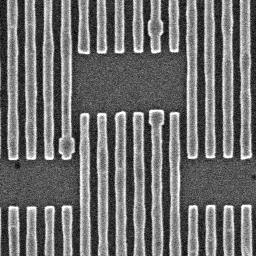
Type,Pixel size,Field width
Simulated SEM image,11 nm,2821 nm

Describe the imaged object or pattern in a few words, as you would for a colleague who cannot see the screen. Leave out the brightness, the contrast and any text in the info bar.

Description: wiring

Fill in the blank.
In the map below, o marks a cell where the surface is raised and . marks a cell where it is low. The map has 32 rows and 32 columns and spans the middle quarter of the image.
oo.............................o
oo.............................o
oo.............................o
oo.............................o
oo.............................o
oo.............................o
oo.............................o
oo.............................o
o..............................o
o..............................o
o..............................o
o..............................o
o............oo...o...ooo..oo..o
o...oo..oo...oo..ooo.oooo..oo..o
oo..oo..oo...oo..ooo.oooo..oo..o
oo..oo..oo...oo...oo..oo...oo..o
oo..oo...o...oo...oo..oo...oo..o
oo..oo...oo..oo...oo..oo...oo..o
oo..oo...oo..oo...oo..oo...oo..o
oo..oo..ooo..oo...oo..oo..ooo..o
oo..oo..ooo..oo...oo..oo..ooo..o
oo..oo..ooo..oo...oo..oo..ooo..o
oo..oo..ooo..oo...oo..oo..ooo..o
o...oo..ooo..oo...oo..oo..ooo..o
....oo..ooo..oo...oo..oo..ooo...
....oo..ooo..oo...oo..oo...oo...
....oo..ooo..oo...oo..oo...oo...
....oo..ooo..oo...oo..oo...oo...
....oo...oo..oo...oo..oo...oo...
....oo...oo..oo...oo..oo...oo...
....oo...oo..oo...oo..oo...oo...
....oo...oo..oo...oo..oo...oo...